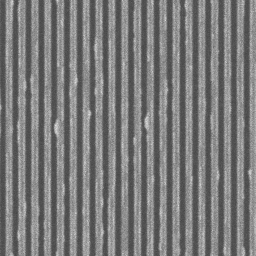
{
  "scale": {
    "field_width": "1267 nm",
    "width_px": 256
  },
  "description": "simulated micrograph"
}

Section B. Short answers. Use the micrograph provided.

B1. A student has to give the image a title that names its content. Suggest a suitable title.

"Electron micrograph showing parallel lines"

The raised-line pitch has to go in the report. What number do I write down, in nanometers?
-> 63.5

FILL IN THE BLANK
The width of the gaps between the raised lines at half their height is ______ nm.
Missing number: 27.8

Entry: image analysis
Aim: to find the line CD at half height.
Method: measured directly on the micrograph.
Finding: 32.8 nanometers